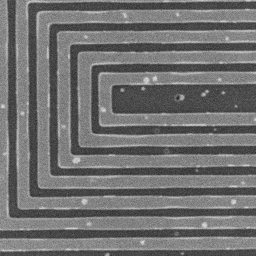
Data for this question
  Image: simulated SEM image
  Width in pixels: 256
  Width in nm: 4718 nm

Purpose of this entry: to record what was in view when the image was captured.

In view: groups of lines, slits or small figures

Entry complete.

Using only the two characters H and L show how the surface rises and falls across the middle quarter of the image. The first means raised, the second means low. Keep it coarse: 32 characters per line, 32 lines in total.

HLLLHHHLLLLLLLLLLLLLLLLLLLLLLLLL
HLLLHHLLLLLLLLLLLLLLLLLLLLLLLLLL
HLLLHHHLLHHHHHHHHHHHHHHHHHHHHHHH
HLLLHHHLLHHHHHHHHHHHHHHHHHHHHHHH
HLLLHHHLLHHHHHHHHHHHHHHHHHHHHHHH
HLLLHHHLLHHHLLLLLLLLLLLLLLLLLLLL
HLLLHHHLLHHHLLLLLLLLLLLLLLLLLLLL
HLLLHHHLLHHHLLLLLLLLLLLLLLLLLLLL
HLLLHHHLLHHHLLLLLLLLLLLLLLLLLHLL
HLLLHHHLLHHHLLLLLLLLLLLLLLLLLLLL
HLLLHHLLLHHHLLLLLLLLLLLLLLLLLLLL
HLLLHHLLLHHHLLLLLLLLLLLLLLLLLLLL
HLLLHHLLLHHHHLLLLLLLLLLLLLLLLLLL
HLLLHHLLLHHHHHHHHHHHHHHHHHHHHHHH
HLLLHHLLLHHHHHHHHHHHHHHHHHHHHHHH
HLLLHHHLLLLLLLLLLLLLLLLLLLLLLLLL
HLLLHHHLLLLLLLLLLLLLLLLLLLLLLLLL
HLLLHHHLLLLLLLLLLLLLLLLLLLLLLLLL
HLLLHHHHHHHHHHHHHHHHHHHHHHHHHHHH
HLLLHHHHHHHHHHHHHHHHHHHHHHHHHHHH
HLLLHHHHHHHHHHHLLLLLLLLLLLLLHHHH
HLLLLLLLLLLLLLLLLLLLLLLLLLLLLLLL
HHLLLLLLLLLLLLLLLLLLLLLLLLLLLLLL
HHHHHHHHHHHHHHHHHHHHHHHHHHHHHHHH
HHHHHHHHHHHHHHHHHHHHHHHHHHHHHHHH
HHHHHHHHHHHHHHHHHHHHHHHHHHHHHHHH
LLLLLLLLLLLLLLLLLLLLLLLLLLLLLLLL
LLLLLLLLLLLLLLLLLLLLLLLLLLLLLLLL
HHHHHHHHHHHHHHHHHHHHHHHHHHHHHHHH
HHHHHHHHHHHHHHHHHHHHHHHHHHHHHHHH
HHHHHHHHHHHHHHHHHHHHHHHHHHHHHHHH
LLLLLLLLLLLLLLLLLLLLLLLLLLLLLLLL